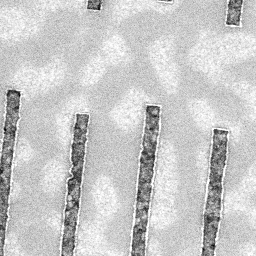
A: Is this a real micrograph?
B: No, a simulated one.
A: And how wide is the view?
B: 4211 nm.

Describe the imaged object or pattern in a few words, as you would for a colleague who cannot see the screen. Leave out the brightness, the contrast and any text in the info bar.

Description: one or a few lines or trenches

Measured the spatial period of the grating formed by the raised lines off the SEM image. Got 69.8 px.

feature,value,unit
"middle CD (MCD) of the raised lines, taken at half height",247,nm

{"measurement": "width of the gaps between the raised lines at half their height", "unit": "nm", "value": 904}